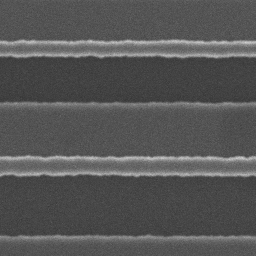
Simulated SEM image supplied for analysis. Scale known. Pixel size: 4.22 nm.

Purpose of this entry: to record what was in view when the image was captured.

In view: lines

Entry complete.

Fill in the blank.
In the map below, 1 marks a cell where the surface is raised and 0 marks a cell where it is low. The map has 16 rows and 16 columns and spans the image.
1111111111111111
1111111111111111
1111111111111111
0100101000111110
0000000000000000
0000000000000000
1111111111111111
1111111111111111
1111111111111111
1111111111111111
1111111111111111
0000000000000000
0000000000000000
0000000000000000
0000000000000000
1111111111111111